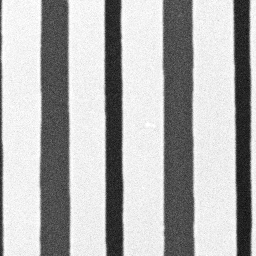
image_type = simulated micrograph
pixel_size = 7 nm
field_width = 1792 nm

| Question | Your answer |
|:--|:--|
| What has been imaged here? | lines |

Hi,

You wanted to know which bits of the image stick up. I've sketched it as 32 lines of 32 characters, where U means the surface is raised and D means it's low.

UUUUUDDDDUUUUDDUUUUUDDDDUUUUUDDU
UUUUUDDDDUUUUDDUUUUUDDDDUUUUUDDU
UUUUUDDDDUUUUDDUUUUUDDDDUUUUUDDU
UUUUUDDDDUUUUDDUUUUUDDDDUUUUUDDU
UUUUUDDDDUUUUDDUUUUUDDDDUUUUUDDU
UUUUUDDDDUUUUDDUUUUUDDDDUUUUUDDU
UUUUUDDDDUUUUDDUUUUUDDDDUUUUUDDU
UUUUUDDDDUUUUDDUUUUUDDDDUUUUUDDU
UUUUUDDDDUUUUDDUUUUUDDDDUUUUUDDU
UUUUUDDDDUUUUDDUUUUUDDDDUUUUUDDU
UUUUUDDDDUUUUDDUUUUUDDDDUUUUUDDU
UUUUUDDDDUUUUDDUUUUUDDDDUUUUUDDU
UUUUUDDDDUUUUDDUUUUUDDDDUUUUUDDU
UUUUUDDDDUUUUDDUUUUUDDDDUUUUUDDU
UUUUUDDDDUUUUDDUUUUUDDDDUUUUUDDU
UUUUUDDDDUUUUDDUUUUUDDDDUUUUUDDU
UUUUUDDDDUUUUDDUUUUUDDDDUUUUUDDU
UUUUUDDDDUUUUDDUUUUUDDDDUUUUUDDU
UUUUUDDDDUUUUDDUUUUUDDDDUUUUUDDU
UUUUUDDDDUUUUDDUUUUUDDDDUUUUUDDU
DUUUUDDDDUUUUDDUUUUUDDDDUUUUUDDU
UUUUUDDDDUUUUDDUUUUUDDDDUUUUUDDU
UUUUUDDDDUUUUDDUUUUUDDDDUUUUUDDU
UUUUUDDDDUUUUDDUUUUUDDDDUUUUUDDD
UUUUUDDDDUUUUDDUUUUUDDDDUUUUUDDD
UUUUUDDDDUUUUDDUUUUUDDDDUUUUUDDD
UUUUUDDDDUUUUDDUUUUUDDDDUUUUUDDD
DUUUUDDDDUUUUDDUUUUUDDDDUUUUUDDD
DUUUUDDDDUUUUDDUUUUUDDDDUUUUUDDD
DUUUUDDDDUUUUDDUUUUUDDDDUUUUUDDD
DUUUUDDDDUUUUDDUUUUUDDDDUUUUUDDD
DUUUUDDDDUUUUDDUUUUUDDDDUUUUUDDD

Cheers